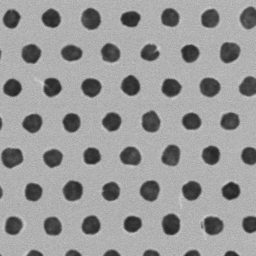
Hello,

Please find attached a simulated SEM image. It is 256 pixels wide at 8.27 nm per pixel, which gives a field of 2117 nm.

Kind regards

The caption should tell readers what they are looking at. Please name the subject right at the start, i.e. a regular array of holes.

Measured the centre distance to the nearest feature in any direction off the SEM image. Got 322 nanometres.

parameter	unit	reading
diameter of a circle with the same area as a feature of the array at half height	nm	160